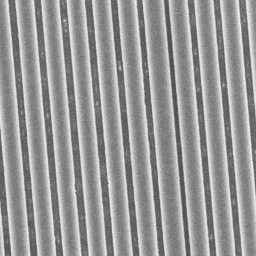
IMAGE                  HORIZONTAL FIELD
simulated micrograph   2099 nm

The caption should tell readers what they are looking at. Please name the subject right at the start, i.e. parallel lines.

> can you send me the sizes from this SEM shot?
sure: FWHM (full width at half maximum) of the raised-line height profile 0.152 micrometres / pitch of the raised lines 209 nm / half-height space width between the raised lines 58.2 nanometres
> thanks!